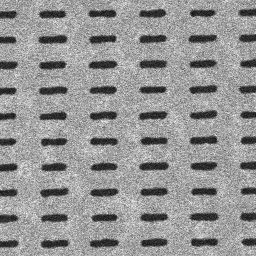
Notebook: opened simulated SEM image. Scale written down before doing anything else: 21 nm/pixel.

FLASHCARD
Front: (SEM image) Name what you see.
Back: a regular array of holes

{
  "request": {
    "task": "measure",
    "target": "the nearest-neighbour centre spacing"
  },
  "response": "532 nanometres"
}